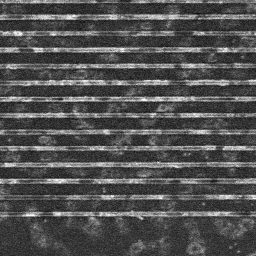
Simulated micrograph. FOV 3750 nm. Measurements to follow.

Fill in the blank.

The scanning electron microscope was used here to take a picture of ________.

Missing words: parallel lines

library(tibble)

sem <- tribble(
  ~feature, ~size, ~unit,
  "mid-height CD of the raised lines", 54.9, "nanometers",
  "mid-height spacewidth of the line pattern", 178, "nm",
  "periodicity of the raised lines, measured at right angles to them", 240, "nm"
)